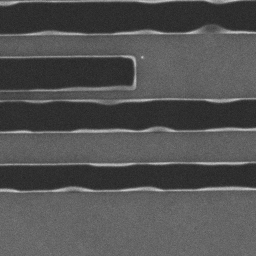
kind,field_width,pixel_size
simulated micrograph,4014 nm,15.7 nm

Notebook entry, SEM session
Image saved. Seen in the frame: groups of lines, slits or small figures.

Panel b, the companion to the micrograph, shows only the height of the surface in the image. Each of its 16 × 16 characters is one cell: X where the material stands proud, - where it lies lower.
XXXXXXXXXXXXXXXX
XXXXXXXXXXXXXXXX
----------------
----------------
XXXXXXXX--------
XXXXXXX---------
XXXXXXXXXXXXXXXX
XXXXXXXXXXXXXXXX
----------------
----------------
XXXXXXXXXXXXXXXX
XXXXXXXXXXXXXXXX
----------------
----------------
----------------
----------------